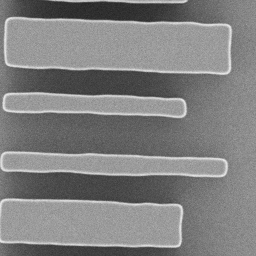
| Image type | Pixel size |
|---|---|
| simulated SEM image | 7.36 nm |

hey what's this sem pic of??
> groups of lines, slits or small figures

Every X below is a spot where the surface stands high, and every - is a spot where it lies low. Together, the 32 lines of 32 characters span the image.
--------------------------------
--------------------------------
-XXXXXXXXXX---------------------
-XXXXXXXXXXXXXXXXXXXXXXXXXXXX---
-XXXXXXXXXXXXXXXXXXXXXXXXXXXX---
-XXXXXXXXXXXXXXXXXXXXXXXXXXXX---
-XXXXXXXXXXXXXXXXXXXXXXXXXXXX---
-XXXXXXXXXXXXXXXXXXXXXXXXXXXX---
----XX-XXXXXXXXXXXXXXXXXXXXXX---
--------------------------------
--------------------------------
--------------------------------
XXXXXXXXXXXXXXXXXXXXXXX---------
XXXXXXXXXXXXXXXXXXXXXXX---------
--------------------XXX---------
--------------------------------
--------------------------------
--------------------------------
--------------------------------
XXXXXXXXXXXXXXXXXX--------------
XXXXXXXXXXXXXXXXXXXXXXXXXXXX----
---------XXXXXXXXXXXXXXXXXXX----
--------------------------------
--------------------------------
--------------------------------
XXXXXXXXXXXXXXXX--X-------------
XXXXXXXXXXXXXXXXXXXXXXX---------
XXXXXXXXXXXXXXXXXXXXXXX---------
XXXXXXXXXXXXXXXXXXXXXXX---------
XXXXXXXXXXXXXXXXXXXXXXX---------
------XXXXXXXXXXXXXXXX----------
--------------------------------